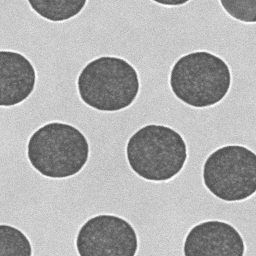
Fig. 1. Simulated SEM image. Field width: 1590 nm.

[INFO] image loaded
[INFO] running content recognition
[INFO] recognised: holes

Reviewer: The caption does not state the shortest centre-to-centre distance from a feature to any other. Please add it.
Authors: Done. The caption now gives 518 nanometers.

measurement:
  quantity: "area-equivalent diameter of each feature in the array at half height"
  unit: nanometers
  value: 356